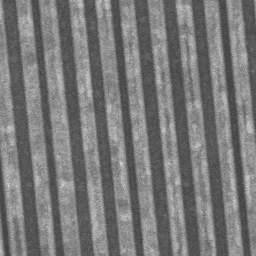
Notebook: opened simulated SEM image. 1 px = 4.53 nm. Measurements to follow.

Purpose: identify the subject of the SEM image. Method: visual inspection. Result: parallel lines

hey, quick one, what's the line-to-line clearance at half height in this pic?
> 67.6 nanometers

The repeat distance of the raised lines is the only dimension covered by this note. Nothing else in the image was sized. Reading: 120 nanometres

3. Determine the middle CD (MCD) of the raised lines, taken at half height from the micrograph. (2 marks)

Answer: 59.2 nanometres